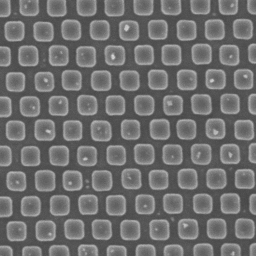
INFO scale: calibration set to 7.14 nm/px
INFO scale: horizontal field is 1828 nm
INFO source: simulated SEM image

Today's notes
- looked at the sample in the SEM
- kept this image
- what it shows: a regular array of raised bodies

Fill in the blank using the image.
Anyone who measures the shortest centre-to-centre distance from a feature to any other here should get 200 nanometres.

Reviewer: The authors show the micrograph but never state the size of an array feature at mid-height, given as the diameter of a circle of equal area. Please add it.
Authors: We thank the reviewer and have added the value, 21.1 pixels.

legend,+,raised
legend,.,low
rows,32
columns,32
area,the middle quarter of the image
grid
................................
................................
++++...+++++..++++...+++++..++++
++++...+++++..++++...+++++..++++
++++...+++++..+++++..+++++..++++
++++...+++++..+++++..+++++..++++
..++.....++.....................
................................
...+++++...++++...++++...++++...
+...++++...++++...++++...+++++..
+...++++...++++...++++...+++++..
+...++++...++++...++++...+++++..
+...+++....++++...++++....+++...
................................
.+++...++++....++++...++++...+++
++++...+++++..+++++...++++..++++
++++...+++++..+++++...++++..++++
++++...+++++..+++++...++++..++++
++++...+++++...+++....++++...+++
................................
...........+++....++++...++++...
+..+++++...++++...++++...++++...
+..+++++...++++...++++...++++...
+...++++...++++...++++...++++...
+...++++...++++...++++...++++...
................................
...............++++...........++
++++...+++++...++++..+++++...+++
++++...+++++...++++..+++++...+++
++++...+++++...++++...++++...+++
++++...+++++...++++...++++...+++
.+++......+.....................